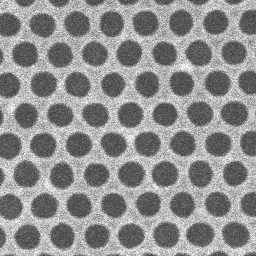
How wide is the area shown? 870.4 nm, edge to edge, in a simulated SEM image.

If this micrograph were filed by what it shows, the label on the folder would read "a regular array of holes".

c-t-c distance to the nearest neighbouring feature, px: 34.2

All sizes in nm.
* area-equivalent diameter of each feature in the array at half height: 86.4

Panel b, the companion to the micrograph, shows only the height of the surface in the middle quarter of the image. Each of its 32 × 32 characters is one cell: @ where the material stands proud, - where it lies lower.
@@@@@@@--@@@@@@--@@@@@@@@-@@@@@@
@@@@@@@@@@@@@@@@@@@@@@@@@@@@@@@@
@@---@@@@@@---@@@@@----@@@@----@
@-----@@@@-----@@@-----@@@------
-------@@------@@@------@@------
-------@@------@@@------@@------
-------@@@-----@@@------@@@-----
@-----@@@@----@@@@@----@@@@@---@
@@@@@@@@@@@@@@@@@@@@@-@@@@@@@@@@
@@@@@@@@@@@@@@@@-@@@@@@@@@@@@@@@
-@@@@-----@@@@-----@@@@-----@@@-
--@@@------@@@-----@@@------@@@-
--@@-------@@-------@@------@@@-
--@@@------@@-------@@------@@@-
--@@@------@@@-----@@@@-----@@@@
-@@@@@@---@@@@@---@@@@@@@-@@@@@@
@@@@@@@@@@@@@@@@@@@@@@@@@@@@@@@@
@@---@@@@@@---@@@@@----@@@@@----
@-----@@@------@@@------@@@-----
@------@@------@@@------@@------
-------@@-------@@------@@------
@------@@@-----@@@------@@@-----
@-----@@@@@---@@@@@----@@@@@----
@@@@@@@@@@@@@@@@@@@@@@@@@@@@@@@@
@@@@@@@@@@@@@@@@--@@@@@@--@@@@@@
-@@@@@----@@@@@----@@@@-----@@@@
--@@@------@@@------@@------@@@-
--@@@------@@-------@@-------@@-
--@@@------@@@------@@------@@@-
--@@@@-----@@@-----@@@@-----@@@@
--@@@@@--@@@@@@@---@@@@@--@@@@@@
@@@@@@@@@@@@@@@@@@@@@@@@@@@@@@@@